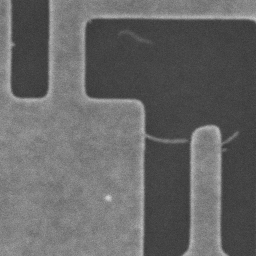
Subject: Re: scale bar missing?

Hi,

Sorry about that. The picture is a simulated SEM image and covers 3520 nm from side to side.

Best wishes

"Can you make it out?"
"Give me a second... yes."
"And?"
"wiring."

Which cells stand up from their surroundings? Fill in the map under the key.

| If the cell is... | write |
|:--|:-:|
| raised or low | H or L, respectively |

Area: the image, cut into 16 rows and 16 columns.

HLLHHHHHHHHHHHHH
HLLHHHLLLLLLLLLL
HLLHHLLLLLLLLLLL
HLLHHLLLLLLLLLLL
HLLHHLLLLLLLLLLL
HLLHHLLLLLLLLLLL
HHHHHHHHHLLLLLLL
HHHHHHHHHLLLLLLL
HHHHHHHHHLLLHHLL
HHHHHHHHHLLLHHLL
HHHHHHHHHLLLHHLL
HHHHHHHHHLLLHHLL
HHHHHHHHHLLLHHLL
HHHHHHHHHLLLHHLL
HHHHHHHHHLLLHHLL
HHHHHHHHHLLLHHLL